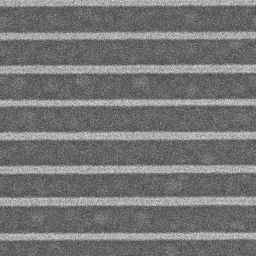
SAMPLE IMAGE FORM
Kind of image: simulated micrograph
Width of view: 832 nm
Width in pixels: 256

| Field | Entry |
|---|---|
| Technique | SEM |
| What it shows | parallel lines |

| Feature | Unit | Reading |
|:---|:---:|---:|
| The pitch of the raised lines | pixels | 33.4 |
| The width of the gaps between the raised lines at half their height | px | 27.1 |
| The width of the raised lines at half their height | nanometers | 21.9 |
